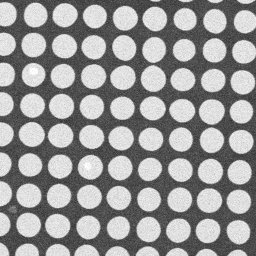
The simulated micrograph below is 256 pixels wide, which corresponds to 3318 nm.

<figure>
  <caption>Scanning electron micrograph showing an array of small figures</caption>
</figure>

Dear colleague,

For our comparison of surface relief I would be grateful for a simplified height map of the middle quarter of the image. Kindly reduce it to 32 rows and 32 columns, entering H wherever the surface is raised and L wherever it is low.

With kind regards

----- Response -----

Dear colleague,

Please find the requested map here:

HLLLLLHHHLLLLLHHLLLLLLHLLLLLLLLL
HHLLLHHHHHLLLHHHHLLLHHHHLLLLLHHL
HHHLHHHHHHLLHHHHHHLHHHHHHLLHHHHH
HHLLHHHHHHLLHHHHHHLHHHHHHLLHHHHH
HHLLLHHHHHLLHHHHHHLHHHHHHLLHHHHH
HLLLLLHHHLLLLHHHHLLLHHHHHLLHHHHH
LLLLLLLLLLLLLLLLLLLLLHHHLLLLLHHL
LLLLLLLLLLLLLLLLLLLLLLLLLLLLLLLL
HHLLLHHHHLLLLHHHLLLLLHHLLLLLLLLL
HHLLHHHHHHLLHHHHHLLLHHHHHLLLHHHL
HHLLHHHHHHLLHHHHHHLHHHHHHLLHHHHH
HHLLHHHHHHLLHHHHHHLHHHHHHLLHHHHH
HHLLLHHHHLLLHHHHHLLLHHHHHLLHHHHH
LLLLLLHHLLLLLHHHLLLLHHHHLLLHHHHH
LLLLLLLLLLLLLLLLLLLLLLLLLLLLLLLL
HLLLLLHLLLLLLLLLLLLLLLLLLLLLLLLL
HHLLHHHHHLLLHHHHLLLLHHHLLLLLHHHL
HHLLHHHHHHLLHHHHHLLHHHHHLLLHHHHH
HHLLHHHHHHLHHHHHHLLHHHHHHLHHHHHH
HHLLHHHHHHLHHHHHHLLHHHHHHLHHHHHH
HLLLLHHHHLLLHHHHHLLHHHHHLLLHHHHH
LLLLLLLLLLLLLLHLLLLLLHHLLLLLHHHL
LLLLLLLLLLLLLLLLLLLLLLLLLLLLLLLL
HLLLLHHHHLLLLHHHLLLLLLLLLLLLLLLL
HHLLHHHHHLLLHHHHHLLHHHHHLLLHHHHL
HHLLHHHHHHLHHHHHHLLHHHHHLLHHHHHH
HHLLHHHHHHLHHHHHHLLHHHHHLLHHHHHH
HLLLHHHHHLLLHHHHHLLHHHHHLLLHHHHH
LLLLLHHHLLLLLHHHLLLLHHHLLLLHHHHL
LLLLLLLLLLLLLLLLLLLLLLLLLLLLLLLL
LLLLLLHLLLLLLLLLLLLLLLLLLLLLLLLL
HLLLHHHHHLLLHHHHLLLHHHHLLLLHHHHL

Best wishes